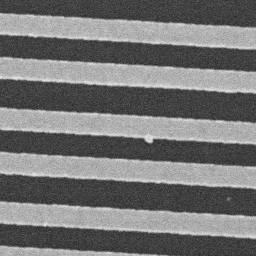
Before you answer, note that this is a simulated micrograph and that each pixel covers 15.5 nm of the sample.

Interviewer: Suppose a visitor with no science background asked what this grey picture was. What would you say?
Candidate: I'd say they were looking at lines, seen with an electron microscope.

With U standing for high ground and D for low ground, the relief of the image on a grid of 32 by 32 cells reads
DDDDDDDDDDDDDDDDDDDDDDDDDDDDDDDD
DDDDDDDDDDDDDDDDDDDDDDDDDDDDDDDD
UUUUUUUUUUUUUDDDDDDDDDDDDDDDDDDD
UUUUUUUUUUUUUUUUUUUUUUUUUUUUUUDD
DDDDDUUUUUUUUUUUUUUUUUUUUUUUUUUU
DDDDDDDDDDDDDDDDDDDDDUUUUUUUUUUU
DDDDDDDDDDDDDDDDDDDDDDDDDDDDDDDD
UUUUUDDDDDDDDDDDDDDDDDDDDDDDDDDD
UUUUUUUUUUUUUUUUUUUUUUDDDDDDDDDD
UUUUUUUUUUUUUUUUUUUUUUUUUUUUUUUU
DDDDDDDDDDDDUUUUUUUUUUUUUUUUUUUU
DDDDDDDDDDDDDDDDDDDDDDDDDDDDUUUU
DDDDDDDDDDDDDDDDDDDDDDDDDDDDDDDD
DDDDDDDDDDDDDDDDDDDDDDDDDDDDDDDD
UUUUUUUUUUUUUUUUDDDDDDDDDDDDDDDD
UUUUUUUUUUUUUUUUUUUUUUUUUUUUUUUU
DDDDDDUUUUUUUUUUUUUUUUUUUUUUUUUU
DDDDDDDDDDDDDDDDDDUDDDDDUUUUUUUU
DDDDDDDDDDDDDDDDDDDDDDDDDDDDDDDD
UUUUUUDDDDDDDDDDDDDDDDDDDDDDDDDD
UUUUUUUUUUUUUUUUUUUUUUUUUDDDDDDD
UUUUUUUUUUUUUUUUUUUUUUUUUUUUUUUU
DDDDDDDDDDDDDDDUUUUUUUUUUUUUUUUU
DDDDDDDDDDDDDDDDDDDDDDDDDDDDDDDU
DDDDDDDDDDDDDDDDDDDDDDDDDDDDDDDD
UUUDDDDDDDDDDDDDDDDDDDDDDDDDDDDD
UUUUUUUUUUUUUUUUUUUUUDDDDDDDDDDD
UUUUUUUUUUUUUUUUUUUUUUUUUUUUUUUU
DDDDDDDDDDDUUUUUUUUUUUUUUUUUUUUU
DDDDDDDDDDDDDDDDDDDDDDDDDDDDUUUU
DDDDDDDDDDDDDDDDDDDDDDDDDDDDDDDD
UUUUUUUUUUUUDDDDDDDDDDDDDDDDDDDD